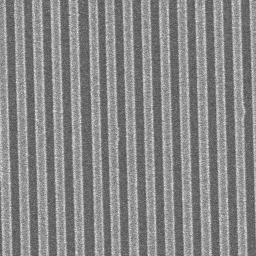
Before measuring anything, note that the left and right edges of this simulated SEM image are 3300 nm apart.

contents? parallel lines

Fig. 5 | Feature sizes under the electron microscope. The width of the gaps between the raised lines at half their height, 9.74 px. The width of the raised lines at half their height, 0.0999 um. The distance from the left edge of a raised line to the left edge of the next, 233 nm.